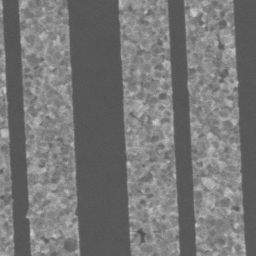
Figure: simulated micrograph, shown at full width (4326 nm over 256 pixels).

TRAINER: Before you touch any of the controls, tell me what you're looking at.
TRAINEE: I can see one or a few lines or trenches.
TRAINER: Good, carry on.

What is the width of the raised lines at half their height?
806 nm